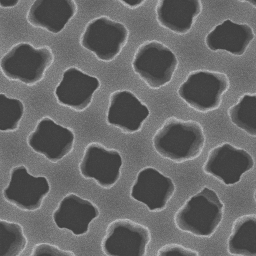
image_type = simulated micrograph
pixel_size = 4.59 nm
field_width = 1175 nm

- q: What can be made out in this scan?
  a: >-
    a regular array of holes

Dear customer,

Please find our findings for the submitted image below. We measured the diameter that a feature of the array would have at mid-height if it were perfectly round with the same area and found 172 nm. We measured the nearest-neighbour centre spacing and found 55 px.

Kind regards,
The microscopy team